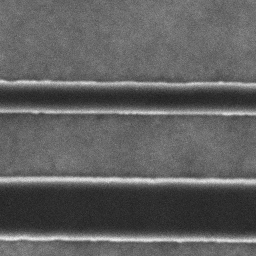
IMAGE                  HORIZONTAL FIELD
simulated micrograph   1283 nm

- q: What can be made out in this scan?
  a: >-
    lines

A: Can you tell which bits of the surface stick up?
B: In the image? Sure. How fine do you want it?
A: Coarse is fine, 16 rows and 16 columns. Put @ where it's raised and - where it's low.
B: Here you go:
----------------
----------------
----------------
----------------
----------------
@@@@@@@@@@@@@@@@
@@@@@@@@@@@@@@@@
----------------
----------------
----------------
----------------
@@@@@@@@@@@@@@@@
@@@@@@@@@@@@@@@@
@@@@@@@@@@@@@@@@
@@@@@@@@@@@@@@@@
----------------